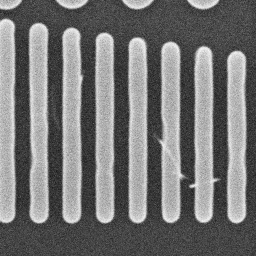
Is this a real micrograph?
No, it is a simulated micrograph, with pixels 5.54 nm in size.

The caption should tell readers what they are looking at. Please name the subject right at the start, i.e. groups of lines, slits or small figures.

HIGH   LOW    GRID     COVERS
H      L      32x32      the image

HHLLLLLLHHLLLLLLHHHLLLLLHHHLLLLL
LLLLLLLLLLLLLLLLLLLLLLLLLLLLLLLL
LLLLLLLLLLLLLLLLLLLLLLLLLLLLLLLL
HHLLHHLLLLLLLLLLLLLLLLLLLLLLLLLL
HHLLHHLLHHLLHHLLLLLLLLLLLLLLLLLL
HHLLHHLLHHLLHHLLHHLLLHLLLLLLLLLL
HHLLHHLLHHLLHHLLHHLLHHLLLHLLLHLL
HHLLHHLLHHLLHHLLHHLLHHLLHHLLLHHL
HHLLHHLLHHLLHHLLHHLLHHLLHHLLLHHL
HHLLHHLLHHLLHHLLHHLLHHLLHHLLLHHL
HHLLHHLLHHLLHHLLHHLLHHLLHHLLLHLL
HHLLHHLLHHLLHHLLHHLLHHLLHHLLLHLL
HHLLHHLLHHLLHHLLHHLLHHLLHHLLLHHL
HHLLHHLLHHLLHHLLHHLLHHLLHHLLLHHL
HHLLHHLLHHLLHHLLHHLLHHLLHHLLLHHL
HHLLHHLLHHLLHHLLHHLLHHLLHHLLLHHL
HHLLHHLLHHLLHHLLHHLLLHLLHHLLLHHL
HHLLHHLLHHLLHHLLHHLLHHLLHHLLLHHL
HHLLHHLLHHLLHHLLHHLLHHLLHHLLLHHL
HHLLHHLLHHLLHHLLHHLLHHLLHHLLLHHL
HHLLHHLLHHLLHHLLHHLLHHLLHHLLLHHL
HHLLHHLLHHLLHHLLHHLLHHHLHHLLLHHL
HHLLHHLLHHLLHHLLHHLLHHHLHHHLHHHL
HHLLHHLLHHLLHHLLHHLLHHLLHHHLLHHL
HHLLHHLLHHLLHHLLHHLLHHLLHHHLLHHL
HHLLHHLLHHLLHHLLHHLLHHLLHHLLLHHL
HHLLHHLLHHLLHHLLHHLLHHLLHHLLLHHL
HLLLHHLLHHLLHHLLLHLLLHLLLHLLLHLL
LLLLLLLLLLLLLLLLLLLLLLLLLLLLLLLL
LLLLLLLLLLLLLLLLLLLLLLLLLLLLLLLL
LLLLLLLLLLLLLLLLLLLLLLLLLLLLLLLL
LLLLLLLLLLLLLLLLLLLLLLLLLLLLLLLL